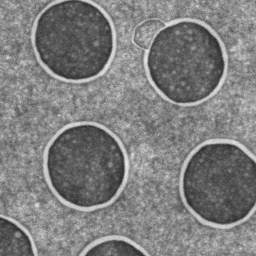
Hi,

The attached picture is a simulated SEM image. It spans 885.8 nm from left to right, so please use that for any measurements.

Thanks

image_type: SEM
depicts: holes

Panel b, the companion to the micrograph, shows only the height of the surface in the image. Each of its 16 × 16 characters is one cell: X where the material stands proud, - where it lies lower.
XXX---XXXXXXXXXX
XX-----XX----XXX
XX-----X------XX
XX-----XX-----XX
XXX---XXX-----XX
XXXXXXXXXX----XX
XXXXXXXXXXXXXXXX
XXXXXXXXXXXXXXXX
XXXX---XXXXXXXXX
XXX-----XXXX---X
XXX-----XXXX----
XXX-----XXX-----
XXXX---XXXXX----
XXXXXXXXXXXX---X
--XXXXXXXXXXXXXX
--XXXX---XXXXXXX